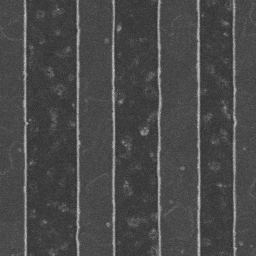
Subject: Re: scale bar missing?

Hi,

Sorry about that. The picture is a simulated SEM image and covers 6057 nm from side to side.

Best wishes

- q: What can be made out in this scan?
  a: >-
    one or a few lines or trenches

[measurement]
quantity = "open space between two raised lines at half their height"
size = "1060 nm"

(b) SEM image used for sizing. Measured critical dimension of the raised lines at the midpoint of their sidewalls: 899 nanometres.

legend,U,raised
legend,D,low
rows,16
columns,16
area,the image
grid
UUDDDUUDDDUUDDDU
UUDDDUUDDDUUDDDU
UUDDDUUDDDUUDDDU
UUDDDUUDDDUUDDDU
UUDDDUUDDDUUDDDU
UUDDDUUDDDUUDDDU
UUDDDUUDDDUUDDDU
UUDDDUUDDDUUDDDU
UUDDDUUDDDUUDDDU
UUDDDUUDDDUUDDDU
UUDDDUUDDDUUDDDU
UUDDDUUDDDUUDDDU
UUDDDUUDDDUUDDDU
UUDDDUUDDDUUDDDU
UUDDDUUDDDUUDDDU
UUDDDUUDDDUUDDDU